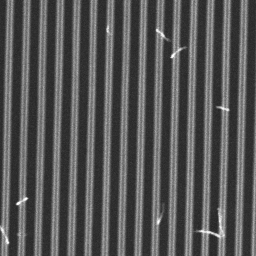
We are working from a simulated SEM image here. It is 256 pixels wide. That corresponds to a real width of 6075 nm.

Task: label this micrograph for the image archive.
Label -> parallel lines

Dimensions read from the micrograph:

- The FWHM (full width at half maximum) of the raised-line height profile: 136 nm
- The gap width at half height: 0.249 um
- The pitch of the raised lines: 396 nanometres